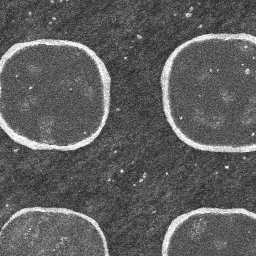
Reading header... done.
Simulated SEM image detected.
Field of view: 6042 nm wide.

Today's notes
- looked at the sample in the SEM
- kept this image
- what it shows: raised bodies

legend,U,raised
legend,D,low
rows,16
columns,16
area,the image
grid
DDDDDDDDDDDDDDDD
DDDDDDDDDDDDDDDD
DDDDDDDDDDDDUUUU
DUUUUUDDDDDUUUUU
UUUUUUDDDDUUUUUU
UUUUUUUDDDUUUUUU
UUUUUUUDDDUUUUUU
UUUUUUUDDDDUUUUU
DUUUUUDDDDDUUUUU
DDDDDDDDDDDDDDDD
DDDDDDDDDDDDDDDD
DDDDDDDDDDDDDDDD
DDDDDDDDDDDDDDDD
DDUUDDDDDDDDUUUU
DUUUDDDDDDDUUUUU
DUUDUUDDDDUUUUUU